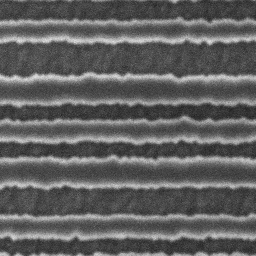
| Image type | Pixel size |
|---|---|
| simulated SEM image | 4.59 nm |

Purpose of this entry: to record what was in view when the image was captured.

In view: lines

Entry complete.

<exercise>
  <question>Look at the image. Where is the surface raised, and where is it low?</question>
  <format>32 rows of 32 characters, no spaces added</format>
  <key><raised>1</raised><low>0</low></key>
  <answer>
00000000000000000000000000000000
00000000000000000000000000000000
00000000010000000000011000001011
11111111111111111111111111111111
11111111111111111111111111111111
00000000000000000000000000000000
00000000000000000000000000000000
00000000000000000000000000000000
00000000000000000000000000000000
00001111001111111111110010111011
11111111111111111111111111111111
11111111111111111111111111111111
11111111111111111111111111111111
00000000000000000000000000000000
00000000000000000000000000000000
11111111111111111111111111111111
11111111111111111111111111111111
11111111111111111111111111111111
00000000000000000000000000000000
00000000000000000000000000000000
11111111111111111111111111111111
11111111111111111111111111111111
11111111111111111111111111111111
00000100000100000111000000000000
00000000000000000000000000000000
00000000000000000000000000000000
00000000000000000000000000000000
11111111111111111111111111111111
11111111111111111111111111111111
11111111111111111111111111111111
00000000000000000000000000000000
00000000000000000000000000000000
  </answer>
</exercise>